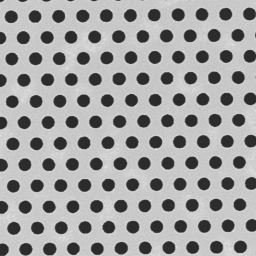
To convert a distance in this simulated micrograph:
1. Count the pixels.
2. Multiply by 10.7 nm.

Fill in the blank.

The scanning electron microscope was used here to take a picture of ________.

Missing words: a regular array of holes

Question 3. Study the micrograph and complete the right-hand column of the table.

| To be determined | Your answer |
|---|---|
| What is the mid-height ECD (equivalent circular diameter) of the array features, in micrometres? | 0.139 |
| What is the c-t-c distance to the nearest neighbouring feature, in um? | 0.254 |